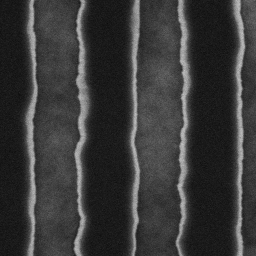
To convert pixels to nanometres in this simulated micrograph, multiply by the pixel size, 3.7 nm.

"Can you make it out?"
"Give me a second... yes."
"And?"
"lines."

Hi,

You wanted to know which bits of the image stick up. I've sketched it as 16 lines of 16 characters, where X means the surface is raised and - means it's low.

XX---XXXX--XXXX-
XX---XXXX--XXXX-
XX---XXXX--XXXX-
XX---XXX---XXXX-
XX---XXX----XXX-
XX---XXX----XXX-
XX---XXXX--XXXX-
XX---XXXX---XXX-
XX---XXX---XXXX-
XX---XXX---XXXX-
XX---XXXX--XXXX-
XX---XXXX--XXXX-
XX---XXXX--XXXX-
XX---XXXX--XXXX-
XX---XXX---XXXX-
XX---XXX---XXXX-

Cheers